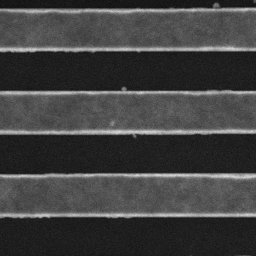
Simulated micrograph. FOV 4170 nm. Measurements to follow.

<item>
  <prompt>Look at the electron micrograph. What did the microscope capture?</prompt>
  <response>lines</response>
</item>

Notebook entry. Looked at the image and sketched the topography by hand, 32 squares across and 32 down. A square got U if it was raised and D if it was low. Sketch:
DDDDDDDDDDDDDDDDDDDDDDDDDDDDDDDD
UUUUUUUUUUUUUUUUUUUUUUUUUUUUUUUU
UUUUUUUUUUUUUUUUUUUUUUUUUUUUUUUU
UUUUUUUUUUUUUUUUUUUUUUUUUUUUUUUU
UUUUUUUUUUUUUUUUUUUUUUUUUUUUUUUU
UUUUUUUUUUUUUUUUUUUUUUUUUUUUUUUU
DDDDDDDDDDDDDDDDDDDDDDDDDDDDDDDD
DDDDDDDDDDDDDDDDDDDDDDDDDDDDDDDD
DDDDDDDDDDDDDDDDDDDDDDDDDDDDDDDD
DDDDDDDDDDDDDDDDDDDDDDDDDDDDDDDD
DDDDDDDDDDDDDDDDDDDDDDDDDDDDDDDD
DDDDDDDDDUUDUUUUUDUUUUUUDDUUUUUU
UUUUUUUUUUUUUUUUUUUUUUUUUUUUUUUU
UUUUUUUUUUUUUUUUUUUUUUUUUUUUUUUU
UUUUUUUUUUUUUUUUUUUUUUUUUUUUUUUU
UUUUUUUUUUUUUUUUUUUUUUUUUUUUUUUU
UUUUUUUUUUUUUUUUUUUUUUUUUUUUUUUU
DDDDDDDDDDDDDDDDDDDDDDDDDDDDDDDD
DDDDDDDDDDDDDDDDDDDDDDDDDDDDDDDD
DDDDDDDDDDDDDDDDDDDDDDDDDDDDDDDD
DDDDDDDDDDDDDDDDDDDDDDDDDDDDDDDD
DDDDDDDDDDDDDDDDDDDDDDDDDDDDDDDD
UUUUUUUUUUUUUUUUUUUUUUUUUUUUUUUU
UUUUUUUUUUUUUUUUUUUUUUUUUUUUUUUU
UUUUUUUUUUUUUUUUUUUUUUUUUUUUUUUU
UUUUUUUUUUUUUUUUUUUUUUUUUUUUUUUU
UUUUUUUUUUUUUUUUUUUUUUUUUUUUUUUU
DDDDDDDDDDDDDDDDDDDDDDDDDDDDDDDD
DDDDDDDDDDDDDDDDDDDDDDDDDDDDDDDD
DDDDDDDDDDDDDDDDDDDDDDDDDDDDDDDD
DDDDDDDDDDDDDDDDDDDDDDDDDDDDDDDD
DDDDDDDDDDDDDDDDDDDDDDDDDDDDDDDD